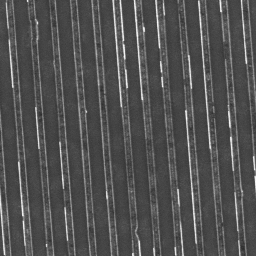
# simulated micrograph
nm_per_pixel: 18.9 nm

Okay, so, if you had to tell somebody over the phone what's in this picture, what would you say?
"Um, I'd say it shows parallel lines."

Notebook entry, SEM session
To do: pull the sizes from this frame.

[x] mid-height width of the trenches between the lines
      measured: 281 nanometres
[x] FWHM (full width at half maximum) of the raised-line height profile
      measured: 0.123 microns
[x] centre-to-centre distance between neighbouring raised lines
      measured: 405 nanometres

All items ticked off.